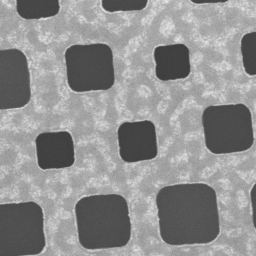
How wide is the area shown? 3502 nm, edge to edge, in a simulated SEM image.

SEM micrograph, holes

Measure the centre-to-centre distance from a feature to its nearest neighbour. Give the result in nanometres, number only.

1130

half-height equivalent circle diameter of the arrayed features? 710 nm